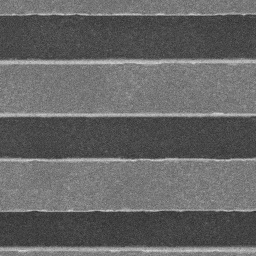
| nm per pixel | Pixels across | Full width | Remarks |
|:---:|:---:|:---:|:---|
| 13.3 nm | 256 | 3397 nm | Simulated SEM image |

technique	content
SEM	lines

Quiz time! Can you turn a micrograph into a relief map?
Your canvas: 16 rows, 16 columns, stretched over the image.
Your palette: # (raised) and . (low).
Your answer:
################
................
................
................
################
################
################
................
................
................
################
################
################
................
................
................